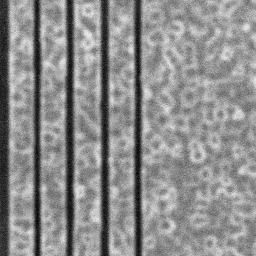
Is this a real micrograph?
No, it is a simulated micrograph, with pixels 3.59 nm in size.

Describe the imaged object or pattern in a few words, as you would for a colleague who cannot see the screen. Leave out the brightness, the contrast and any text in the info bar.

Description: parallel lines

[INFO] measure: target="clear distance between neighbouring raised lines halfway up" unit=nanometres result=28.7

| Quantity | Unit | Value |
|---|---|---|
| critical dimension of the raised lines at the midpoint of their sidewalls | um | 0.0857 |